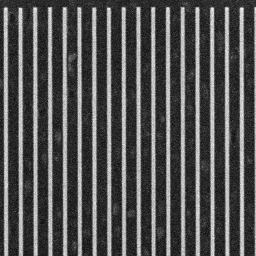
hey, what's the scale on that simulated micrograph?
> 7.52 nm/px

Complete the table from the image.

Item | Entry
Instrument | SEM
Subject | parallel lines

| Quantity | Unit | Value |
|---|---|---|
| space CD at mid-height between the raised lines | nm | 87.4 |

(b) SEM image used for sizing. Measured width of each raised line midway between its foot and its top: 0.0207 µm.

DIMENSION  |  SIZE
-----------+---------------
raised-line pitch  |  111 nm